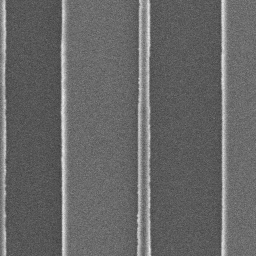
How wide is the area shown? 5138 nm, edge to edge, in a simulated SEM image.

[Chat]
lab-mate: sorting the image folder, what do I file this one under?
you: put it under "lines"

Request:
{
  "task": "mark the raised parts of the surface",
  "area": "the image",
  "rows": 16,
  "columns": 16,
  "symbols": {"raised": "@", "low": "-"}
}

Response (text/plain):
----@@@@@-----@@
----@@@@@-----@@
----@@@@@-----@@
----@@@@@-----@@
----@@@@@-----@@
----@@@@@-----@@
----@@@@@-----@@
----@@@@@-----@@
----@@@@@-----@@
----@@@@@-----@@
----@@@@@-----@@
----@@@@@-----@@
----@@@@@-----@@
----@@@@@-----@@
----@@@@@-----@@
----@@@@@-----@@